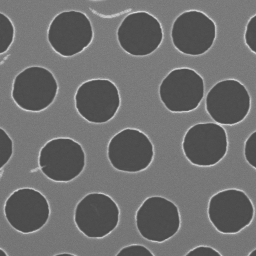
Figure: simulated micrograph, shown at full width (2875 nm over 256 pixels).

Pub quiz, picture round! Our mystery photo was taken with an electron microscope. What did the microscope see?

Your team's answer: a regular array of holes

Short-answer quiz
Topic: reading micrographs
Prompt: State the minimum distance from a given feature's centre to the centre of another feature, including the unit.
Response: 60.6 px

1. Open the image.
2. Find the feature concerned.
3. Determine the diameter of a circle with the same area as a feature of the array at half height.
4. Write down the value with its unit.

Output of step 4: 490 nm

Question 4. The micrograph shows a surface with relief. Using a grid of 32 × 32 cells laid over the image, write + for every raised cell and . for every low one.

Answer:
++++++++++++++++++++++++++++++++
++++++++..++++++++++++++.+++++++
.++++++....+++++....++....+++++.
..++++.....++++.....++.....++++.
..++++.....++++.....++.....++++.
.+++++.....++++.....++.....++++.
+++++++...++++++...++++..+++++++
++++++++++++++++++++++++++++++++
++++.+++++++++++++++++++++++++++
++.....++++++++++++++....+++++++
++.....+++....++++++.....++...++
++.....+++.....+++++.....+.....+
++.....++......+++++.....+.....+
+++..+++++.....++++++...++.....+
++++++++++....++++++++++++.....+
+++++++++++++++++++++++++....+++
.++++++++++++++..++++++.....++++
.++++++..+++++.....++++.....+++.
..+++.....++++.....++++.....+++.
.++++......+++.....++++.....+++.
.++++.....++++.....+++++...++++.
+++++.....++++++++++++++++++++++
+++++++..+++++++++++++++++++++++
++++++++++++++++++++++++++++++++
+....++++++..++++++++++++++....+
+.....++++....++++....++++.....+
+.....++++.....++.....++++......
+.....+++......++.....++++.....+
++...+++++....+++.....+++++...++
+++++++++++..+++++...+++++++++++
++++++++++++++++++++++++++++++++
+++++++++++++++....+++++...+++++